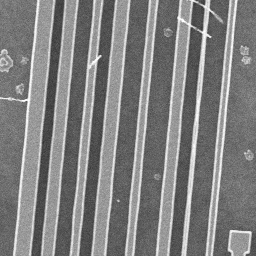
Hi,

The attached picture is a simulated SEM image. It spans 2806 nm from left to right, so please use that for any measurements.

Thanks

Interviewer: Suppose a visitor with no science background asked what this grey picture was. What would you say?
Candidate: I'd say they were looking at groups of lines, slits or small figures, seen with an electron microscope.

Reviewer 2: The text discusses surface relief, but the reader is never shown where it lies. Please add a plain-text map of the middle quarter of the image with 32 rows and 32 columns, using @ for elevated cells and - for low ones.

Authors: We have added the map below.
@@----@@---@@@@-----@@------@@@-
@@----@@---@@@@-----@@------@@--
@@----@@---@@@@-----@@-----@@@--
@@----@@---@@@@-----@@-----@@@--
@-----@@---@@@------@------@@@--
@-----@----@@@-----@@------@@@--
@-----@----@@@-----@@------@@@--
@----@@----@@@-----@@------@@@--
@----@@----@@@-----@@------@@@--
@----@@----@@@-----@@------@@@--
@----@@----@@@-----@@------@@@--
@----@@---@@@@-----@@------@@---
@----@@---@@@@-----@@------@@---
@----@@---@@@@-----@-------@@---
@----@@---@@@@-----@------@@@---
@----@@---@@@------@------@@@---
----@@@---@@@------@------@@@---
----@@----@@@-----@@------@@@---
----@@----@@@-----@@------@@@---
----@@----@@@-----@@------@@@---
----@@---@@@@-----@@------@@@---
----@@---@@@@-----@@------@@@---
----@@---@@@@-----@@------@@----
----@@---@@@@-----@@-----@@@----
----@@---@@@------@@-----@@@----
----@@---@@@------@------@@@----
----@@---@@@-----@@------@@@----
----@@---@@@-----@@------@@@---@
----@@---@@@-----@@------@@@---@
---@@----@@@-----@@------@@@---@
---@@----@@@-----@@------@@@---@
---@@----@@@-----@@------@@@---@